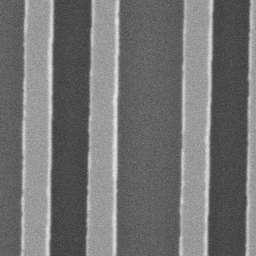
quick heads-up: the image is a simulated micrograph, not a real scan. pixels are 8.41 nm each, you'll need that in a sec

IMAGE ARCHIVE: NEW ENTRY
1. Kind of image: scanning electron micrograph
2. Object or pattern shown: lines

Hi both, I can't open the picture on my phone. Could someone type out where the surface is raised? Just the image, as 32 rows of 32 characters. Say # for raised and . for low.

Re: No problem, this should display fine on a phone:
...####.....###........####....#
...####.....###........####....#
...####.....###........###.....#
...####....####........###.....#
...####....####........###.....#
...####....####........###.....#
...###.....####........###.....#
...###.....####........###.....#
...###.....####........###.....#
...###.....####........###.....#
...###.....####........###.....#
...###.....####........###.....#
...###.....####........###.....#
...###.....####........###.....#
...###.....####........###.....#
...###.....####........###.....#
...###.....####........###.....#
...###.....####........###.....#
...###.....####........###.....#
...###.....####........###.....#
...###.....####........###.....#
...###.....####........###.....#
...###.....####........###.....#
...###.....###.........###.....#
...###.....###.........###.....#
...###.....###.........###.....#
...###.....###.........###.....#
...###.....###.........###.....#
...###.....###.........###.....#
...###.....###.........###.....#
...###.....###.........###.....#
...###.....###.........###.....#